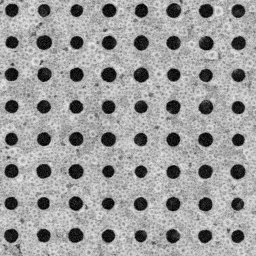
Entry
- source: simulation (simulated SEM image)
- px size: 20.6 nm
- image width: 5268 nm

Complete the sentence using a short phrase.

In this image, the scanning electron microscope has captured a regular array of holes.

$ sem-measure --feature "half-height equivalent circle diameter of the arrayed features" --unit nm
291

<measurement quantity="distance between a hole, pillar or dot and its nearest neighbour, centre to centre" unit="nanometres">340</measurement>